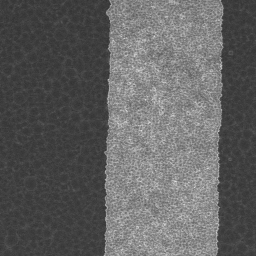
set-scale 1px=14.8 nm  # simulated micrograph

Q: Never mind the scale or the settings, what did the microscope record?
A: one or a few lines or trenches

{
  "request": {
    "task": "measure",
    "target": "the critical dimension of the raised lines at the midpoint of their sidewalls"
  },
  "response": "1.48 um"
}